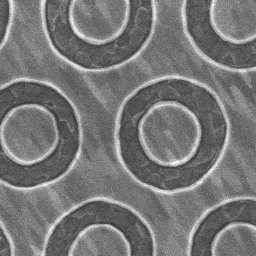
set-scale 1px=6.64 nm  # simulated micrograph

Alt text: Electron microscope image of ring-shaped grooves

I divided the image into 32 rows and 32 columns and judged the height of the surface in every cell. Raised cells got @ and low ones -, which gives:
-@@@@----@@@@@@@---@@@@---@@@@@@
-@@@@----@@@@@@@---@@@@---@@@@@@
-@@@@----@@@@@@@---@@@@---@@@@@@
-@@@@@---@@@@@@----@@@@----@@@@@
-@@@@@----@@@@@----@@@@@----@@@@
@@@@@@------------@@@@@@--------
@@@@@@@----------@@@@@@@@-------
@@@@@@@@@-------@@@@@@@@@@------
@@@@@@@@@@----@@@@@@@@@@@@@@@---
@@@@@@@@@@@@@@@@@@@@@@@@@@@@@@@@
@-----@@@@@@@@@@@@@------@@@@@@@
-------@@@@@@@@@@---------@@@@@@
--------@@@@@@@@-----------@@@@@
--@@@----@@@@@@----@@@@-----@@@@
-@@@@@@---@@@@@---@@@@@@----@@@@
@@@@@@@---@@@@@---@@@@@@@---@@@@
@@@@@@@---@@@@@---@@@@@@@---@@@@
@@@@@@@---@@@@@---@@@@@@@---@@@@
-@@@@@@---@@@@@---@@@@@@----@@@@
-@@@@@----@@@@@----@@@@@----@@@@
---------@@@@@@-----@@-----@@@@@
--------@@@@@@@@----------@@@@@@
-------@@@@@@@@@@--------@@@@@@@
@@--@@@@@@@@@@@@@@@-----@@@@@@@@
@@@@@@@@@@@@@@@@@@@@@@@@@@@@@@@@
@@@@@@@@@@-----@@@@@@@@@@@@@----
@@@@@@@@@--------@@@@@@@@@------
@@@@@@@-----------@@@@@@@-------
@@@@@@@----@@@-----@@@@@----@@@@
-@@@@@----@@@@@----@@@@@---@@@@@
-@@@@@---@@@@@@@---@@@@@---@@@@@
-@@@@@---@@@@@@@---@@@@@---@@@@@